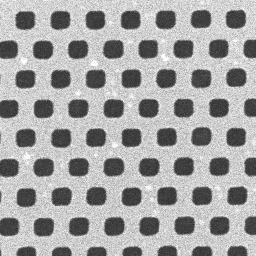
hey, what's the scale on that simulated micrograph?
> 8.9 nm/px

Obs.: a regular array of holes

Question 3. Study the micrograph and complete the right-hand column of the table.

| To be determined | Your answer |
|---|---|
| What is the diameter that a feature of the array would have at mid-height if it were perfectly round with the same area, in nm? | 186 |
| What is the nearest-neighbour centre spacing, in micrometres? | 0.302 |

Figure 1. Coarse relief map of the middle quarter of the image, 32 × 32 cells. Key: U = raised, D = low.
UUUUUUUUUUUUUUUUUUUUUUUUUUUUUUUU
DUUUUUUDDUUUUUUDDDDUUUUUDDDUUUUU
DDUUUUDDDDDUUUDDDDDUUUUDDDDDUUUU
DDUUUDDDDDDUUUDDDDDUUUUDDDDDUUUU
DDUUUDDDDDDUUUDDDDDUUUUDDDDDUUUU
DUUUUUDDDDUUUUDDDDDUUUUUDDDUUUUU
UUUUUUUUUUUUUUUUUUUUUUUUUUUUUUUU
UUUUUUUUUUUUUUUUUUUUUUUUUUUUUUUU
UUUUUUUUUUUUUUUUUUUUUUUUUUUUUUUU
UDDDDDUUUUDDDDDUUUUDDDDUUUUUDDDD
UDDDDDUUUUDDDDDUUUDDDDDDUUUDDDDD
UDDDDDUUUUDDDDDUUUDDDDDDUUUDDDDD
UDDDDDUUUUDDDDDUUUUDDDDUUUUUDDDD
UUUDUUUUUUUDDUUUUUUUDDUUUUUUUDUU
UUUUUUUUUUUUUUUUUUUUUUUUUUUUUUUU
UUUUUUUUUUUUUUUUUUUUUUUUUUUUUUUU
DUUUUUDDDDUUUUUDDDDUUUUUDDDDUUUU
DDUUUDDDDDDUUUDDDDDUUUUDDDDDUUUU
DDUUUDDDDDDUUUDDDDDUUUUDDDDDUUUU
DDUUUDDDDDUUUUDDDDDUUUUDDDDDUUUU
DUUUUUDDDDUUUUUDDDDUUUUUDDDUUUUU
UUUUUUUUUUUUUUUUUUUUUUUUUUUUUUUU
UUUUUUUUUUUUUUUUUUUUUUUUUUUUUUUU
UUDDDUUUUUUDDDUUUUUUDDDUUUUUUDDD
UDDDDDUUUUDDDDDUUUUDDDDDUUUUDDDD
UDDDDDUUUUDDDDDUUUUDDDDDUUUDDDDD
UDDDDDUUUUDDDDDUUUUDDDDDUUUDDDDD
UDDDDDUUUUDDDDDUUUUDDDDUUUUUDDDD
UUUUUUUUUUUUUUUUUUUUUUUUUUUUUUUU
UUUUUUUUUUUUUUUUUUUUUUUUUUUUUUUU
UUUUUUUUUUUUUUUUUUUUUUUUUUUUUUUU
DDUUUUDDDDDUUUUDDDDUUUUUDDDDUUUU